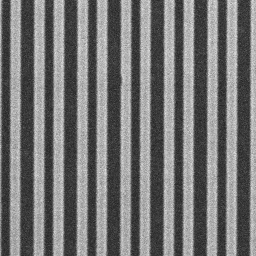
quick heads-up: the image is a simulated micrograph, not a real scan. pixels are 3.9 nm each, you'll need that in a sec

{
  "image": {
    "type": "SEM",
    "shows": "parallel lines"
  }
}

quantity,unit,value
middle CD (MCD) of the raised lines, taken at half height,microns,0.039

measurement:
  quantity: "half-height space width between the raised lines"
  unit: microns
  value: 0.0463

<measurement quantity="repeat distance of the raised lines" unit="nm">84.4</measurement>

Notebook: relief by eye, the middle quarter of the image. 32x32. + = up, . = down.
...+++..+++...+++..+++...++...++
...+++..+++...+++..+++...++...++
...+++..+++...++...+++...++...++
...+++..+++....+...+++...++...++
...+++..+++....+...+++...++...++
...+++..+++...++...+++...++...++
...+++..+++...++...+++...++...++
...+++..+++...++...+++...++...++
...+++..+++...++...+++...++...++
...+++..+++...++...+++...++...++
...+++..+++...++...+++...++...++
...+++..+++...+++..++....++...++
...+++..+++...++...++....++...++
...+++..+++...++...++....++...++
...+++..+++...++...++....++...++
...+++..+++...++...++....++...++
...+++..+++...+++..++....++...++
...+++..+++...+++..++....++...++
...+++..+++...++...++....++...++
...+++..+++...++...++....++...++
...+++..+++...++...++....++...++
...+++..++....+++..++....++...++
...+++..++....+++..++....++...++
...+++..++....+++..++....++...++
...+++..++....+++..++....++...++
...+++..++....+++..++....++...++
...+++..++....++...++....++...++
...+++..++....++...++....++...++
...+++..++....++...++....++...++
...+++..++....+++..++....++...++
...+++..++....+++..++....++...++
...+++..++....+++..++....++...++